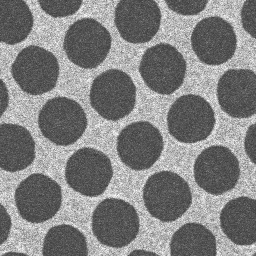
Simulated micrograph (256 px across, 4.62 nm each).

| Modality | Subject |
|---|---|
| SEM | a regular array of holes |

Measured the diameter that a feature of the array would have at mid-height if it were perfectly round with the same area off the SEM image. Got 0.224 um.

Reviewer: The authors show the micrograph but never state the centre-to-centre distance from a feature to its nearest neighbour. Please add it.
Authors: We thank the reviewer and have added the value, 0.264 µm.